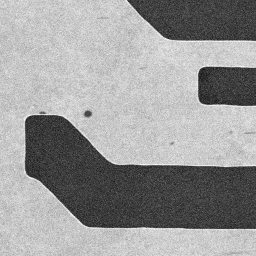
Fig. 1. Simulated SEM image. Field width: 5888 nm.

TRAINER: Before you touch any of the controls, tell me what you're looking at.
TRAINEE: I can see groups of lines, slits or small figures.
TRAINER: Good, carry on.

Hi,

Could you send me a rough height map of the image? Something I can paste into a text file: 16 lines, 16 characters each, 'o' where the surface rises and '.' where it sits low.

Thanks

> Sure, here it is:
oooooooo........
ooooooooo.......
ooooooooooo.....
oooooooooooooooo
ooooooooooooo...
oooooooooooo....
ooooooooooooo...
oo..oooooooooooo
oo...ooooooooooo
oo....oooooooooo
oo..............
ooo.............
oooo............
ooooo...........
oooooooooooooooo
oooooooooooooooo